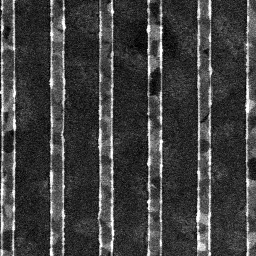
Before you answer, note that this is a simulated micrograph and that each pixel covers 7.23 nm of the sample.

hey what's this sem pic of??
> parallel lines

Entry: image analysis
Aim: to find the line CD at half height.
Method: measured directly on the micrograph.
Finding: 95.3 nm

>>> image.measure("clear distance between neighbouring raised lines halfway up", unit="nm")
258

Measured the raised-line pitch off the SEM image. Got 49 px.